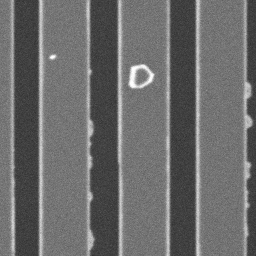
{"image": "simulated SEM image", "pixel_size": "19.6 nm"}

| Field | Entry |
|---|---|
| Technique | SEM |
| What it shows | lines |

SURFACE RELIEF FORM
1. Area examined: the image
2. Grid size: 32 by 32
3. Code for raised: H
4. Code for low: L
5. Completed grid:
HHLLLHHHHHHLLLLHHHHHHLLLLHHHHHHL
HHLLLHHHHHHLLLLHHHHHHLLLLHHHHHHL
HHLLLHHHHHHLLLLHHHHHHLLLLHHHHHHL
HHLLLHHHHHHLLLLHHHHHHLLLLHHHHHHL
HHLLLHHHHHHLLLLHHHHHHLLLLHHHHHHL
HHLLLHHHHHHLLLLHHHHHHLLLLHHHHHHL
HHLLLHHHHHHLLLLHHHHHHLLLLHHHHHHL
HHLLLHHHHHHLLLLHHHHHHLLLLHHHHHHL
HHLLLHHHHHHLLLLHHHHHHLLLLHHHHHHL
HHLLLHHHHHHLLLLHHHHHHLLLLHHHHHHL
HHLLLHHHHHHLLLLHHHHHHLLLLHHHHHHL
HHLLLHHHHHHLLLLHHHHHHLLLLHHHHHHL
HHLLLHHHHHHLLLLHHHHHHLLLLHHHHHHL
HHLLLHHHHHHLLLLHHHHHHLLLLHHHHHHL
HHLLLHHHHHHLLLLHHHHHHLLLLHHHHHHL
HHLLLHHHHHHLLLLHHHHHHLLLLHHHHHHL
HHLLLHHHHHHLLLLHHHHHHLLLLHHHHHHL
HHLLLHHHHHHLLLLHHHHHHLLLLHHHHHHL
HHLLLHHHHHHLLLLHHHHHHLLLLHHHHHHL
HHLLLHHHHHHLLLLHHHHHHLLLLHHHHHHL
HHLLLHHHHHHLLLLHHHHHHLLLLHHHHHHL
HHLLLHHHHHHLLLLHHHHHHLLLLHHHHHHL
HHLLLHHHHHHLLLLHHHHHHLLLLHHHHHHL
HHLLLHHHHHHLLLLHHHHHHLLLLHHHHHHL
HHLLLHHHHHHLLLLHHHHHHLLLLHHHHHHL
HHLLLHHHHHHLLLLHHHHHHLLLLHHHHHHL
HHLLLHHHHHHLLLLHHHHHHLLLLHHHHHHL
HHLLLHHHHHHLLLLHHHHHHLLLLHHHHHHL
HHLLLHHHHHHLLLLHHHHHHLLLLHHHHHHL
HHLLLHHHHHHLLLLHHHHHHLLLLHHHHHHL
HHLLLHHHHHHLLLLHHHHHHLLLLHHHHHHL
HHLLLHHHHHHLLLLHHHHHHLLLLHHHHHHL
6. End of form